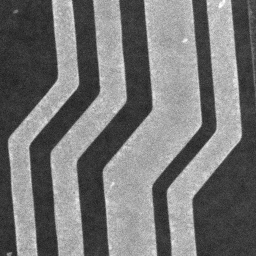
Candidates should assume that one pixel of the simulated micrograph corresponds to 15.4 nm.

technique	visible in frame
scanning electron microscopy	groups of lines, slits or small figures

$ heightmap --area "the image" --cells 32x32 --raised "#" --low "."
.......##...###...######..###..#
.......##...###...######..###..#
.......##...###...######..###..#
.......##...###...######..###..#
.......##...###....#####..###..#
.......##...###....#####..###..#
.......###..###....######.###...
.......###..###....######.###...
.......###..###....######..##...
.......###...###...######..###..
.......###...###...######..###..
......###...####...######..###..
.....###....####...######..###..
....###....####....######..###..
....###...####.....######..###..
...###...####.....#######..###..
..###....####....#######...###..
.###....####....########..####..
.###...####....########..####...
.###..####....########...###....
.###...###...########...###.....
.###...###...#######...####.....
..##...###...######...####......
..##...###...######..####.......
..##...###...######..###........
..##...###...######..###........
..##...###...######..###........
..##...###...######..###........
..##...###....#####..###........
..##...###....#####..###........
..##...###....#####...##........
..###..###....#####...##........